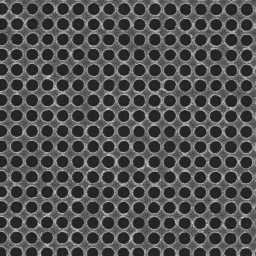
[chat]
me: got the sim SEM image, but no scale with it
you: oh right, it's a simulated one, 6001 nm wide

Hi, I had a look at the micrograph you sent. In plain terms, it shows a regular array of holes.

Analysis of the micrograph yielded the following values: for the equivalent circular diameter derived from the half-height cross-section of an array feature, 280 nm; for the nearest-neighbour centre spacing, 354 nanometres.